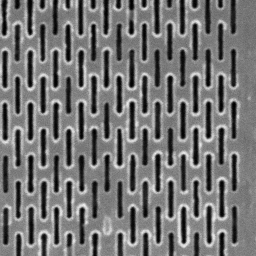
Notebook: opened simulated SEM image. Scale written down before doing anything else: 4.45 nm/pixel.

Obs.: a regular array of holes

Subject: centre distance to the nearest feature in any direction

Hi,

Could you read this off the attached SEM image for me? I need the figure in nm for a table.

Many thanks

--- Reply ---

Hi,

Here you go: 113